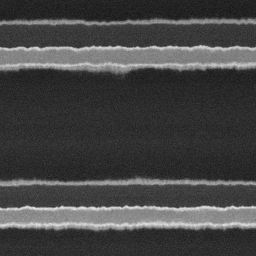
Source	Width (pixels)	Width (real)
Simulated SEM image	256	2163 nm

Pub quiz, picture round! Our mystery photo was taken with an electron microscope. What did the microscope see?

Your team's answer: lines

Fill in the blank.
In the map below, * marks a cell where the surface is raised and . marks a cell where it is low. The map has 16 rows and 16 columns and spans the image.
................
******.*********
****************
****************
................
................
................
................
................
................
................
.***************
****************
****************
................
................